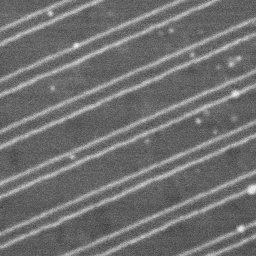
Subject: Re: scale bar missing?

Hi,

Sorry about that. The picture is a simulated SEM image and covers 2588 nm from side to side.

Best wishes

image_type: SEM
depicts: lines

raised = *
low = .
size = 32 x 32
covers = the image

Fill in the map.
.......*****.........*****......
.....****..........*****........
..*****..........*****.........*
*****.........*****..........***
***.........*****..........*****
..........*****..........****...
........****..........*****.....
......****..........*****.......
...*****..........****..........
.****..........*****..........**
****.........*****..........****
*..........*****..........****..
.........****..........*****....
......*****..........*****......
....*****..........****.........
..*****..........****..........*
*****..........****..........***
**..........*****..........****.
..........****..........*****...
........****..........*****.....
.....*****..........****........
...****..........*****..........
.****..........****..........***
***..........****..........*****
*..........****..........*****..
........*****..........****.....
......****..........*****.......
....****..........*****.........
.*****..........*****.........**
***...........****..........****
*...........****..........****..
.........*****..........****....